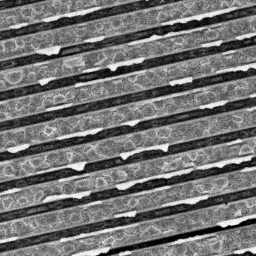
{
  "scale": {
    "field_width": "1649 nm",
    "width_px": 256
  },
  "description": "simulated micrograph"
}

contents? parallel lines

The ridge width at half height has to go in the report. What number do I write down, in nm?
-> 133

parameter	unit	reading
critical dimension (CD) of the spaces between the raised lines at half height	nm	57.4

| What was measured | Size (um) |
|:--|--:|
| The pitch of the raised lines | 0.19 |